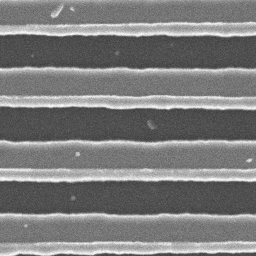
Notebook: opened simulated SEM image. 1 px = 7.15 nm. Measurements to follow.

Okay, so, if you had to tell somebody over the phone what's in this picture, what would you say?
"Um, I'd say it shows lines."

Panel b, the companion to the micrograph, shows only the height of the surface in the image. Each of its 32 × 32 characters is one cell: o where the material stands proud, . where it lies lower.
oooooooooooooooooooooooooooooooo
oooooooooooooooooooooooooooooooo
oooooooooooooooooooooooooooooooo
oooooooooooooooooooooooooooooooo
................................
................................
................................
................................
................................
oooooooooooooooooooooooooooooooo
oooooooooooooooooooooooooooooooo
oooooooooooooooooooooooooooooooo
oooooooooooooooooooooooooooooooo
...............o....o......oo.oo
................................
................................
................................
................................
oooooooooooooooooooooooooooooooo
oooooooooooooooooooooooooooooooo
oooooooooooooooooooooooooooooooo
oooooooooooooooooooooooooooooooo
ooooooooooooo.....oo.o.ooooooooo
................................
................................
................................
................................
oooooooooooooooooooooooooooooooo
oooooooooooooooooooooooooooooooo
oooooooooooooooooooooooooooooooo
oooooooooooooooooooooooooooooooo
ooooooooooooooooooooooooooooooo.